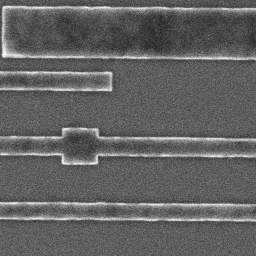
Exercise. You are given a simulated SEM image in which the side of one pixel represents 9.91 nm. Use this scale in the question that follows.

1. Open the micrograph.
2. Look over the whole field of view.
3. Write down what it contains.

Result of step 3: wiring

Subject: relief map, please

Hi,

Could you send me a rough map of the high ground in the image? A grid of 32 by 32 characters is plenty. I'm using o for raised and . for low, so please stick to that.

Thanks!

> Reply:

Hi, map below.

................................
oooooooooooooooooooooooooooooooo
oooooooooooooooooooooooooooooooo
oooooooooooooooooooooooooooooooo
oooooooooooooooooooooooooooooooo
oooooooooooooooooooooooooooooooo
oooooooooooooooooooooooooooooooo
................................
................................
oooooooooooooo..................
oooooooooooooo..................
................................
................................
................................
................................
................................
........oooo....................
oooooooooooooooooooooooooooooooo
oooooooooooooooooooooooooooooooo
.......ooooo......oooooooooooooo
........ooo.....................
................................
................................
................................
................................
oooooooooooooo..................
oooooooooooooooooooooooooooooooo
..................oo..ooo..ooooo
................................
................................
................................
................................